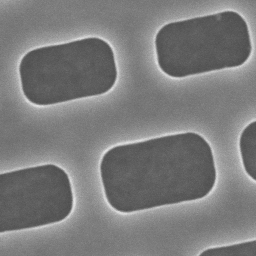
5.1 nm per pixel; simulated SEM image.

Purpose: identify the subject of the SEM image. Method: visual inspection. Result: holes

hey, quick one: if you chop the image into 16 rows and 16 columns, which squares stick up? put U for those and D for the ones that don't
UUUUUUUUUUUUUUUU
UUUUUUUUUUUDDDDU
UUUUUDUUUUDDDDDD
UUDDDDDUUUDDDDDD
UDDDDDDUUUDDDUUU
UDDDDDDUUUUUUUUU
UUDUUUUUUUUUUUUU
UUUUUUUUUUUUUUUU
UUUUUUUUUUDDDUUD
UUUUUUUDDDDDDUUD
UUDDUUDDDDDDDUUD
DDDDUUDDDDDDDUUU
DDDDDUUDDDDDUUUU
DDDDUUUUUUUUUUUU
UUUUUUUUUUUUUUUU
UUUUUUUUUUUUUDDD